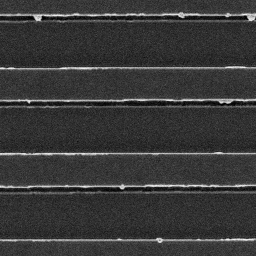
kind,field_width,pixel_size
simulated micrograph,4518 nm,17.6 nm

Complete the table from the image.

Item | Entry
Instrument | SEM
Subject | lines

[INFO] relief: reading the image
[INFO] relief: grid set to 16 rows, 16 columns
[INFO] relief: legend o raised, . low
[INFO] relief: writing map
oooooooooooooooo
................
................
................
oooooooooooooooo
oooooooooooooooo
................
................
................
................
oooooooooooooooo
oooooooooooooooo
................
................
................
oooooooooooooooo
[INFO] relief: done